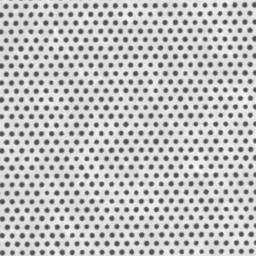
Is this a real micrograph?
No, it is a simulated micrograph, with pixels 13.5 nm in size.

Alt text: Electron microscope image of a regular array of holes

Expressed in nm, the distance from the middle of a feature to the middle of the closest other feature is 129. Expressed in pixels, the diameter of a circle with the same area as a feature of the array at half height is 5.97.